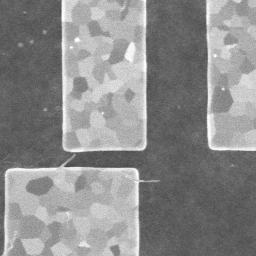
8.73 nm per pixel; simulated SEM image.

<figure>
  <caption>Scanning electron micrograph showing wiring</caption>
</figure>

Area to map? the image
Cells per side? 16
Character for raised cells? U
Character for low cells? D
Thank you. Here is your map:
DDDDUUUUUDDDDUUU
DDDDUUUUUDDDDUUU
DDDDUUUUUDDDDUUU
DDDDUUUUUDDDDUUU
DDDDUUUUUDDDDUUU
DDDDUUUUUDDDDUUU
DDDDUUUUUDDDDUUU
DDDDUUUUUDDDDUUU
DDDDUUUUUDDDDUUU
DDDDDDDDDDDDDDDD
DDDUUUDDDDDDDDDD
UUUUUUUUUDDDDDDD
UUUUUUUUUDDDDDDD
UUUUUUUUUDDDDDDD
UUUUUUUUUDDDDDDD
UUUUUUUUUDDDDDDD